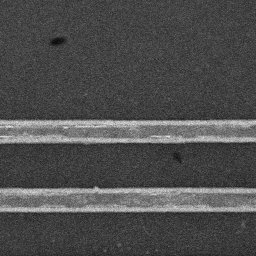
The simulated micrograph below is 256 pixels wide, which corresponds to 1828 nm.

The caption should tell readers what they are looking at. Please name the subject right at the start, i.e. one or a few lines or trenches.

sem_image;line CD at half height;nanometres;129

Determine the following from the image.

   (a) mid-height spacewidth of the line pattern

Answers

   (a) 0.362 µm